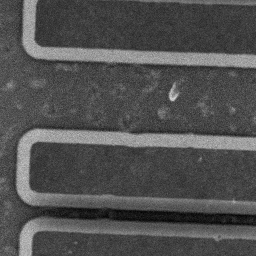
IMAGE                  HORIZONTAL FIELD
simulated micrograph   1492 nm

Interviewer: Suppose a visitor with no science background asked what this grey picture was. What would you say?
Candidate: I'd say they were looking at one or a few lines or trenches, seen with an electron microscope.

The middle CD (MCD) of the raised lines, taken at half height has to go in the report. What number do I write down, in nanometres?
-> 366